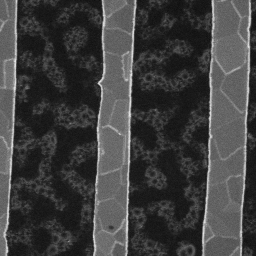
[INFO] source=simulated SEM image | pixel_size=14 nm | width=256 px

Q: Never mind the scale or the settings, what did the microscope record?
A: one or a few lines or trenches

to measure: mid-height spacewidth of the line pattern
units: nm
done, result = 1120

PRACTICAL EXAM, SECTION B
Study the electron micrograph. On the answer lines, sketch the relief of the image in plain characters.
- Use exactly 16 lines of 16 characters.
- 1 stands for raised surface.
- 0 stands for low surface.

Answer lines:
1000001100000111
1000001100000111
1000001100000111
1000001100000111
1000001100000111
1000001100000111
1000001100000110
1000001100000110
1000001100000110
1000001100000110
1000001100000110
1000001100000110
1000001100000110
0000001100000110
0000001100000110
0000001100000110